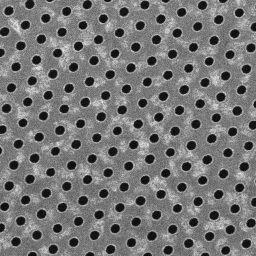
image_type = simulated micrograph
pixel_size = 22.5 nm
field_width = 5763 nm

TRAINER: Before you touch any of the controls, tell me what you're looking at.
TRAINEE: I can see a regular array of holes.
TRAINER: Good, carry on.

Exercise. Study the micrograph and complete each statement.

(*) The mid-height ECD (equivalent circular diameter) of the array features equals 9.24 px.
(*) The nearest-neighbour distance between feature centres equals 478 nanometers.